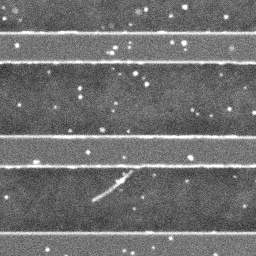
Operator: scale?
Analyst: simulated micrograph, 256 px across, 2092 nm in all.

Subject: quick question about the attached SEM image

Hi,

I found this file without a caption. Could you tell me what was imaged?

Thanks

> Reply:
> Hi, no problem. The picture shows lines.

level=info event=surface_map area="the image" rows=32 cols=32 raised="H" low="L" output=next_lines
LLLLLLLLLLLLLLLLLLLLLLLLLLLLLLLL
LLLLLLLLLLLLLLLLLLLLLLLLLLLLLLLL
LLLLLLLLLLLLLLLLLLLLLLLLLLLLLLLL
LLLLLLLLLLLLLLLLLLLLLLLLLLLLLLLL
HHHHHHHHHHHHHHHHHHHHHHHHHHHHHHHH
HHHHHHHHHHHHHHHHHHHHHHHHHHHHHHHH
HHHHHHHHHHHHHHHHHHHHHHHHHHHHHHHH
HHHHHHHHHHHHHHHHHHHHHHHHHHHHHHHH
LLLLLLLLLLLLLLLLLLLLLLLLLLLLLLLL
LLLLLLLLLLLLLLLLLLLLLLLLLLLLLLLL
LLLLLLLLLLLLLLLLLLLLLLLLLLLLLLLL
LLLLLLLLLLLLLLLLLLLLLLLLLLLLLLLL
LLLLLLLLLLLLLLLLLLLLLLLLLLLLLLLL
LLLLLLLLLLLLLLLLLLLLLLLLLLLLLLLL
LLLLLLLLLLLLLLLLLLLLLLLLLLLLLLLL
LLLLLLLLLLLLLLLLLLLLLLLLLLLLLLLL
LLLLLLLLLLLLLLLLLLLLLLLLLLLLLLLL
HHHHHHHHHHHHHHHHHHHHHHHHHHHHHHHH
HHHHHHHHHHHHHHHHHHHHHHHHHHHHHHHH
HHHHHHHHHHHHHHHHHHHHHHHHHHHHHHHH
HHHHHHHHHHHHHHHHHHHHHHHHHHHHHHHH
LLLLLLLLLLLLLLLLLLLLLLLLLLLLLLLL
LLLLLLLLLLLLLLLLLLLLLLLLLLLLLLLL
LLLLLLLLLLLLLLLLLLLLLLLLLLLLLLLL
LLLLLLLLLLLLLLLLLLLLLLLLLLLLLLLL
LLLLLLLLLLLLLLLLLLLLLLLLLLLLLLLL
LLLLLLLLLLLLLLLLLLLLLLLLLLLLLLLL
LLLLLLLLLLLLLLLLLLLLLLLLLLLLLLLL
LLLLLLLLLLLLLLLLLLLLLLLLLLLLLLLL
HHHHHHHHHHHHHHHHHHHHHHHHHHHHHHHH
HHHHHHHHHHHHHHHHHHHHHHHHHHHHHHHH
HHHHHHHHHHHHHHHHHHHHHHHHHHHHHHHH